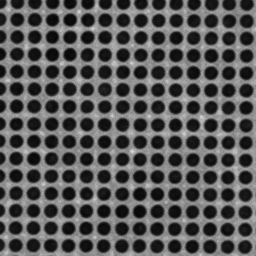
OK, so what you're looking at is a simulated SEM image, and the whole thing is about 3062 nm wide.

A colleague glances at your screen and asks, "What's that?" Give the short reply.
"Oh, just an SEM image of a regular array of holes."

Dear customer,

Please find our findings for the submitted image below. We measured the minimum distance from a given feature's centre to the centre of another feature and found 205 nm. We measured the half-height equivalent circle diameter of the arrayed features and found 169 nanometers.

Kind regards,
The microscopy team